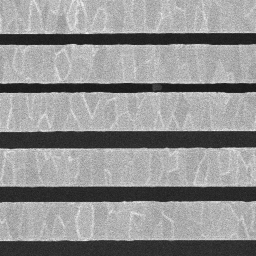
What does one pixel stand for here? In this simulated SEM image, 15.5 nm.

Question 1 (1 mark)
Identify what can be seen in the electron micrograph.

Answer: lines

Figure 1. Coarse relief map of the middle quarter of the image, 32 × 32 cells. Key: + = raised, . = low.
++++++++++++++++++++++++++++++++
++++++++++++++++++++++++++++++++
++++++++++++++++++++++++++++++++
++++++++++++++++++++++++++++++++
++++++++++++++++++++++++++++++++
................................
................................
++++++++++++++++++++++++++++++++
++++++++++++++++++++++++++++++++
++++++++++++++++++++++++++++++++
++++++++++++++++++++++++++++++++
++++++++++++++++++++++++++++++++
++++++++++++++++++++++++++++++++
++++++++++++++++++++++++++++++++
++++++++++++++++++++++++++++++++
++++++++++++++++++++++++++++++++
++++++++++++++++++++++++++++++++
................................
................................
................................
................................
++++++++++++++++++++++++++++++++
++++++++++++++++++++++++++++++++
++++++++++++++++++++++++++++++++
++++++++++++++++++++++++++++++++
++++++++++++++++++++++++++++++++
++++++++++++++++++++++++++++++++
++++++++++++++++++++++++++++++++
++++++++++++++++++++++++++++++++
++++++++++++++++++++++++++++++++
................................
................................